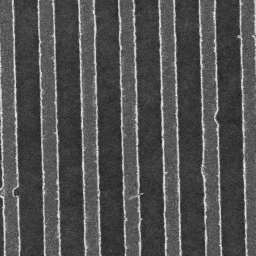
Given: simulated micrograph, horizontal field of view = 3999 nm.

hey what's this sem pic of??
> parallel lines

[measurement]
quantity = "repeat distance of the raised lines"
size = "629 nanometres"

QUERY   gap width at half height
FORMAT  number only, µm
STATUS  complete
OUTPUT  0.396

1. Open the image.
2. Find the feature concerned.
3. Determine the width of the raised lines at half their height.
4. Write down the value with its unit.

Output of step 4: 240 nm